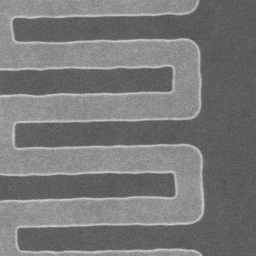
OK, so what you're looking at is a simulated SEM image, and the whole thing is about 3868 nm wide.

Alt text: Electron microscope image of groups of lines, slits or small figures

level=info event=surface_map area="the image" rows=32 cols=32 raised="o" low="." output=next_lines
ooooooooooooooooooooooooo.......
oooooooooooooooooooooooo........
oo..............................
oo..............................
oo..............................
oooooooooooooooooooooooo........
ooooooooooooooooooooooooo.......
ooooooooooooooooooooooooo.......
oooooooo.ooooo.......oooo.......
......................ooo.......
......................ooo.......
.....................oooo.......
ooooooooooooooooooooooooo.......
ooooooooooooooooooooooooo.......
oooooooooooooooooooooooo........
oo..............................
oo..............................
oo..............................
oo.ooo.oooooooooooooooooo.......
ooooooooooooooooooooooooo.......
ooooooooooooooooooooooooo.......
ooooooooooooooooooooooooo.......
......................ooo.......
......................ooo.......
......................ooo.......
ooooooooooooooooooooooooo.......
ooooooooooooooooooooooooo.......
ooooooooooooooooooooooooo.......
ooo.............................
oo..............................
oo..............................
ooooooooooooooooooooooooo.......